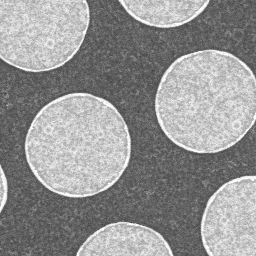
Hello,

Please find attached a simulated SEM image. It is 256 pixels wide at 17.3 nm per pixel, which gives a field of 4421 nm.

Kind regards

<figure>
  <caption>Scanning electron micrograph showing raised bodies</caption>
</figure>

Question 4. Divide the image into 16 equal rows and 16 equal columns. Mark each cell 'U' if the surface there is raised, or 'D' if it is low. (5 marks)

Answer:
UUUUUDDDUUUUUDDD
UUUUUDDDDUUDDDDD
UUUUUDDDDDDDDDDD
UUUUDDDDDDDDUUUD
DDDDDDDDDDUUUUUU
DDDDDDDDDDUUUUUU
DDDUUUUDDDUUUUUU
DDUUUUUUDDUUUUUU
DDUUUUUUDDDUUUUD
DDUUUUUUDDDDUDDD
DDUUUUUUDDDDDDDD
DDDUUUUDDDDDDDUU
DDDDDDDDDDDDDUUU
DDDDDDDDDDDDDUUU
DDDDDDUUUUDDDUUU
DDDDDUUUUUUDDUUU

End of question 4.